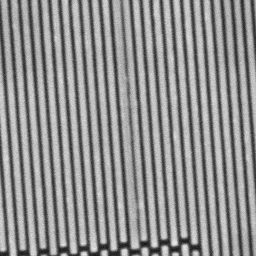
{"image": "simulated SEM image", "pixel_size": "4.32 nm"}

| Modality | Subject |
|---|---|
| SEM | parallel lines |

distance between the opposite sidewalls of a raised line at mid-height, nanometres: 25.3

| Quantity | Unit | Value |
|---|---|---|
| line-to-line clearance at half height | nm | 16.7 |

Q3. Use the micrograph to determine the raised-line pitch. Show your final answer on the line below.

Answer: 43.6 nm